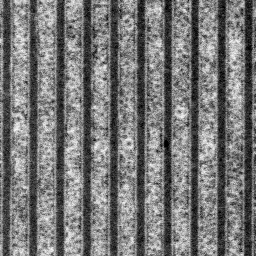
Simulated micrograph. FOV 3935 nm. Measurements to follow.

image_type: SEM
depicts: parallel lines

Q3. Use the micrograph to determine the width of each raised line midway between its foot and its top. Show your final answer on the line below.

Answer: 0.146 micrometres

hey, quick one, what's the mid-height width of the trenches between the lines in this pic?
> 265 nm